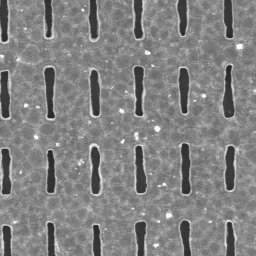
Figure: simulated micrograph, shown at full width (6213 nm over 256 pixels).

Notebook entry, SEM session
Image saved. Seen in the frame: a regular array of holes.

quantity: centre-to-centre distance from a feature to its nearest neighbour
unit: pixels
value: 44.6